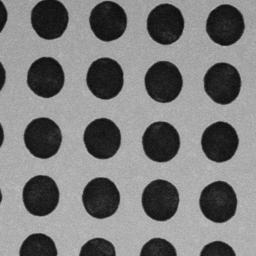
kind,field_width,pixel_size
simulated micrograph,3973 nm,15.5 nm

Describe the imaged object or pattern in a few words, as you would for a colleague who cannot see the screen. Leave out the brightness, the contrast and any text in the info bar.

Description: a regular array of holes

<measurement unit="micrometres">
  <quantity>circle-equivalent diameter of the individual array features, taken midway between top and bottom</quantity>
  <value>0.62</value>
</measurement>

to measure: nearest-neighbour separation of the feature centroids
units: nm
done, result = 900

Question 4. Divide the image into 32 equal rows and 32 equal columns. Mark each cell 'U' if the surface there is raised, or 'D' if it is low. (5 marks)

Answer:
UUUUUDDDUUUUDDDUUUUUDUUUUUUUUUUU
DUUUDDDDUUUDDDDDUUUDDDDUUUDDDDUU
DUUUDDDDDUUDDDDDUUDDDDDUUUDDDDUU
UUUUDDDDUUUDDDDDUUDDDDDUUUDDDDDU
UUUUUDDDUUUUDDDUUUUDDDDUUUDDDDUU
UUUUUUUUUUUUUUUUUUUUDUUUUUUDDUUU
UUUUUUUUUUUUUUUUUUUUUUUUUUUUUUUU
UUUUUDDUUUUUDDUUUUUUUUUUUUUUUUUU
DUUUDDDDUUUDDDDUUUUDDDUUUUDDDUUU
DUUDDDDDUUUDDDDUUUDDDDDUUUDDDDUU
DUUDDDDDUUUDDDDUUUDDDDDUUDDDDDUU
UUUUDDDUUUUDDDDUUUDDDDDUUUDDDDUU
UUUUUUUUUUUUUUUUUUUDDDUUUUUDDUUU
UUUUUUUUUUUUUUUUUUUUUUUUUUUUUUUU
UUUUUUUUUUUUUUUUUUUUUUUUUUUUUUUU
UUUUDDDUUUUDDDUUUUUDDUUUUUDDDUUU
UUUDDDDDUUDDDDDUUUDDDDUUUDDDDDUU
UUUDDDDDUUDDDDDUUUDDDDUUUDDDDDUU
UUUDDDDUUUUDDDDUUUDDDDUUUDDDDDUU
UUUUDDDUUUUDDDUUUUDDDDUUUUDDDUUU
UUUUUUUUUUUUUUUUUUUUUUUUUUUUUUUU
UUUUUUUUUUUUUUUUUUUUUUUUUUUUUUUU
UUUUDDDUUUUDDDUUUUUDUUUUUUUUUUUU
UUUDDDDUUUUDDDDUUUDDDDUUUUDDDUUU
UUUDDDDUUUDDDDDUUUDDDDUUUDDDDDUU
UUUDDDDUUUDDDDDUUUDDDDUUUDDDDDUU
UUUUDDUUUUUDDDUUUUDDDDUUUDDDDUUU
UUUUUUUUUUUUUUUUUUUDDUUUUUDDDUUU
UUUUUUUUUUUUUUUUUUUUUUUUUUUUUUUU
UUUUDDUUUUUUUUUUUUUUUUUUUUUUUUUU
UUUDDDDUUUUDDDUUUUDDDUUUUUDDUUUU
UUDDDDDUUUDDDDUUUUDDDDUUUDDDDUUU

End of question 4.